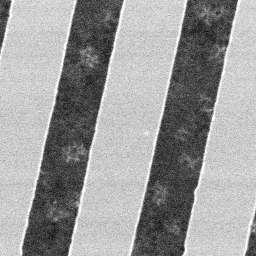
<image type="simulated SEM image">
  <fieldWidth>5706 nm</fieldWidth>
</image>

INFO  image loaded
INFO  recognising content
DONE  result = one or a few lines or trenches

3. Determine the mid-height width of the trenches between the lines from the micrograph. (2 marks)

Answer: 1350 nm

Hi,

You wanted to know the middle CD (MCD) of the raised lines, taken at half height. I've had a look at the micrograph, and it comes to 1.08 micrometres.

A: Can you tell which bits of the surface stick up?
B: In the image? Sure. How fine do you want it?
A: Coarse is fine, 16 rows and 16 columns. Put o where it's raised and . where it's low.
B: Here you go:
o....ooo....ooo.
o...ooo....oooo.
....ooo....ooo..
....ooo....ooo..
....ooo....ooo..
....ooo...oooo..
...ooo....oooo..
...ooo....ooo...
...ooo....ooo...
...ooo....ooo...
..ooo....oooo...
..ooo....ooo....
..ooo....ooo....
..ooo....ooo....
..ooo...oooo....
.ooo....oooo...o